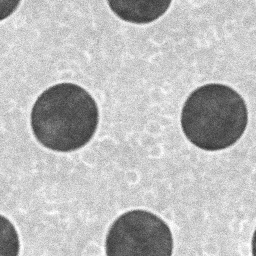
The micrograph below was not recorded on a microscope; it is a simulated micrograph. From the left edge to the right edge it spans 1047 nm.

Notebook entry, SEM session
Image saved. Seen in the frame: holes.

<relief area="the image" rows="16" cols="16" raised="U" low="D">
DUUUUUUDDDUUUUUU
UUUUUUUUUUUUUUUU
UUUUUUUUUUUUUUUU
UUUUUUUUUUUUUUUU
UUUUUUUUUUUUUUUU
UUUDDUUUUUUUDDUU
UUDDDDUUUUUUDDDU
UUDDDDUUUUUDDDDU
UUDDDDUUUUUUDDDU
UUUUUUUUUUUUUUUU
UUUUUUUUUUUUUUUU
UUUUUUUUUUUUUUUU
UUUUUUUUUUUUUUUU
UUUUUUUUDDUUUUUU
DUUUUUUDDDDUUUUU
DUUUUUUDDDDUUUUU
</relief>